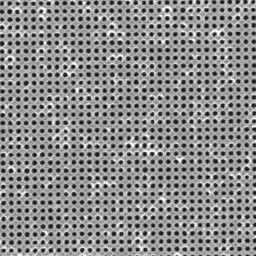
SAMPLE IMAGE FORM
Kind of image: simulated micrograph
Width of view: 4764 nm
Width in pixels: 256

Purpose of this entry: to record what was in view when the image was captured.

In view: a regular array of holes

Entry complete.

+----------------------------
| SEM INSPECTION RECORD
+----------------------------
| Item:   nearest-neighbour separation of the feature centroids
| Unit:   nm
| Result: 141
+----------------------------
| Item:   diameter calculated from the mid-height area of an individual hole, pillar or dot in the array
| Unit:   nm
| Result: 91.5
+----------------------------